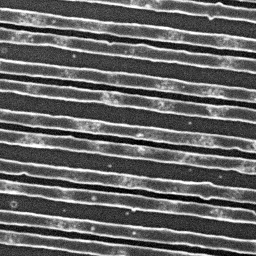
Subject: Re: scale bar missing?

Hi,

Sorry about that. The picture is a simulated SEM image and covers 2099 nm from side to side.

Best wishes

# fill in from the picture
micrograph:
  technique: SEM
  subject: parallel lines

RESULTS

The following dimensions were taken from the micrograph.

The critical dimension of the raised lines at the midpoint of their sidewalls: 111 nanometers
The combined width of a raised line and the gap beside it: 204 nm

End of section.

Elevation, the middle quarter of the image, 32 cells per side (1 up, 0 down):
00000000000000000000000000000000
11111111000000000000000000000000
11111111111111110000000000000000
11111111111111111111111100000000
00000011111111111111111111111110
00000000000000111111111111111111
11111100000000000000000111111111
11111111111111100000000000000001
11111111111111111111111100000000
00000000011111111111111111111100
00000000000001111111111111111111
00000000000000000000001111111111
00000000000000000000000000001111
11000000000000000000000000000000
11111111110000000000000000000000
11111111111111110000000000000000
10111111111111111111111111000000
00000000001111111111111111111111
11100000000000000111111111111111
11111111111000000000000011111111
11111111111111111110000000000000
01111111111111111111111111100000
00000000011111111111111111111111
00000000000000000111111111111111
00000000000000000000000011111111
00000000000000000000000000000000
11111000000000000000000000000000
11111111111111000000000000000000
11111111111111111111100000000000
00111111111111111111111111111100
00000000000011111111111111111111
11111100000000000000011111111111